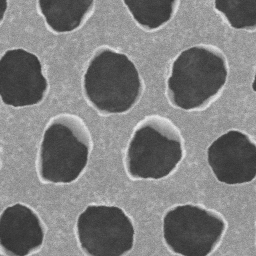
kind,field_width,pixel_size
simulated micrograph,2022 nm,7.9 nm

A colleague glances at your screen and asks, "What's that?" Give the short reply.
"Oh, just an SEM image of holes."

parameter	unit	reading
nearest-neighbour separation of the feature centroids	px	82.4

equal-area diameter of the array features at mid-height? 460 nanometres